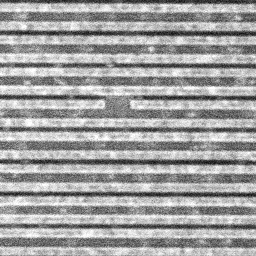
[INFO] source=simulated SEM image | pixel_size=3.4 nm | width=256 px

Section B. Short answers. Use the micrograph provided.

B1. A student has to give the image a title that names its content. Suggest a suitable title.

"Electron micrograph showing parallel lines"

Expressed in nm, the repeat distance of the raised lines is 55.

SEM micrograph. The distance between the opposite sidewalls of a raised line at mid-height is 26.3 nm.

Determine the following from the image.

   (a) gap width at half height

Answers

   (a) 0.0353 micrometres